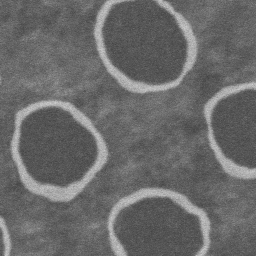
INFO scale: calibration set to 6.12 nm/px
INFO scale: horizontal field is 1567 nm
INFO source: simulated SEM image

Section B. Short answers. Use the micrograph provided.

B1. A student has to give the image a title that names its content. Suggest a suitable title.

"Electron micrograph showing raised bodies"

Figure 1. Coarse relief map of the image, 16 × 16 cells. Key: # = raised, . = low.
.......####.....
......#####.....
......######....
......######....
.......#####....
.........#.....#
.............###
.####........###
.#####.......###
.#####........##
.#####........##
..###...........
........###.....
.......######...
.......######...
.......######...